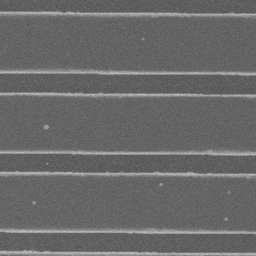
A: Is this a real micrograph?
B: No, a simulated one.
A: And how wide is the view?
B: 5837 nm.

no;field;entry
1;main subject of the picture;lines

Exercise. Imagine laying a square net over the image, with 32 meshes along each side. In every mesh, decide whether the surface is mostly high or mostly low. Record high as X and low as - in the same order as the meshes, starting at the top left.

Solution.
--------------------------------
--------------------------------
XXXXXXXXXXXXXXXXXXXXXXXXXXXXXXXX
XXXXXXXXXXXXXXXXXXXXXXXXXXXXXXXX
XXXXXXXXXXXXXXXXXXXXXXXXXXXXXXXX
XXXXXXXXXXXXXXXXXXXXXXXXXXXXXXXX
XXXXXXXXXXXXXXXXXXXXXXXXXXXXXXXX
XXXXXXXXXXXXXXXXXXXXXXXXXXXXXXXX
XXXXXXXXXXXXXXXXXXXXXXXXXXXXXXXX
--------------------------------
--------------------------------
--------------------------------
XXXXXXXXXXXXXXXXXXXXXXXXXXXXXXXX
XXXXXXXXXXXXXXXXXXXXXXXXXXXXXXXX
XXXXXXXXXXXXXXXXXXXXXXXXXXXXXXXX
XXXXXXXXXXXXXXXXXXXXXXXXXXXXXXXX
XXXXXXXXXXXXXXXXXXXXXXXXXXXXXXXX
XXXXXXXXXXXXXXXXXXXXXXXXXXXXXXXX
XXXXXXXXXXXXXXXXXXXXXXXXXXXXXXXX
--------------------------------
--------------------------------
--------------------------------
XXXXXXXXXXXXXXXXXXXXXXXXXXXXXXXX
XXXXXXXXXXXXXXXXXXXXXXXXXXXXXXXX
XXXXXXXXXXXXXXXXXXXXXXXXXXXXXXXX
XXXXXXXXXXXXXXXXXXXXXXXXXXXXXXXX
XXXXXXXXXXXXXXXXXXXXXXXXXXXXXXXX
XXXXXXXXXXXXXXXXXXXXXXXXXXXXXXXX
XXXXXXXXXXXXXXXXXXXXXXXXXXXXXXXX
--------------------------------
--------------------------------
X-------------------------------